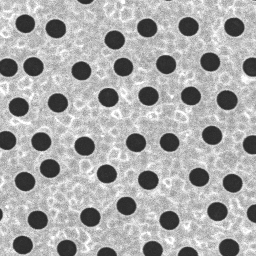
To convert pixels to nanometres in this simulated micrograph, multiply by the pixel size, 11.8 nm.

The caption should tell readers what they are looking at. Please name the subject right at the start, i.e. a regular array of holes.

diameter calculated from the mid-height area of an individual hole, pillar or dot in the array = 234 nm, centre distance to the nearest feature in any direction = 407 nm